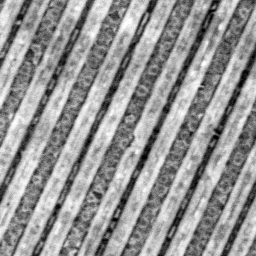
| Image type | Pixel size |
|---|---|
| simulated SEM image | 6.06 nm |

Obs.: parallel lines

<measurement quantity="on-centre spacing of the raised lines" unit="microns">0.172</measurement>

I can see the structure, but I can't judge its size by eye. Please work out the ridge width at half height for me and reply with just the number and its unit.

0.0755 micrometres